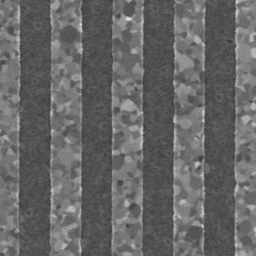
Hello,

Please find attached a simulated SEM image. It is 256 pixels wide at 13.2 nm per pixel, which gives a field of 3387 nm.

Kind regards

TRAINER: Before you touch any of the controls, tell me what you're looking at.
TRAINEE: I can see one or a few lines or trenches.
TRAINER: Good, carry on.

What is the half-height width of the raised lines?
397 nanometres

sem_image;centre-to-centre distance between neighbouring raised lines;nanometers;801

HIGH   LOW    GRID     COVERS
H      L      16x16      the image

HLLHHLLHHLLHHLLH
HLLHHLLHHLLHHLLH
HLLHHLLHHLLHHLLH
HLLHHLLHHLLHHLLH
HLLHHLLHHLLHHLLH
HLLHHLLHHLLHHLLH
HLLHHLLHHLLHHLLH
HLLHHLLHHLLHHLLH
HLLHHLLHHLLHHLLH
HLLHHLLHHLLHHLLH
HLLHHLLHHLLHHLLH
HLLHHLLHHLLHHLLH
HLLHHLLHHLLHHLLH
HLLHHLLHHLLHHLLH
HLLHHLLHHLLHHLLH
HLLHHLLHHLLHHLLH